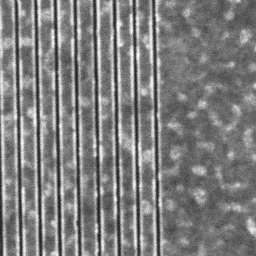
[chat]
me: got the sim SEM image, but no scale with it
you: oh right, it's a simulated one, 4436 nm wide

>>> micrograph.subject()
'parallel lines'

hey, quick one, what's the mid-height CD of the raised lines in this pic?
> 260 nm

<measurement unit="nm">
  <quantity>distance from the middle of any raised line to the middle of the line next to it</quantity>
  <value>340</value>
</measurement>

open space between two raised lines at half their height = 91 nm